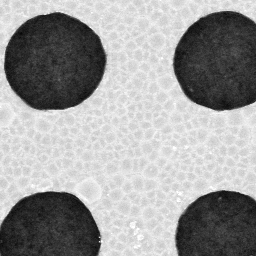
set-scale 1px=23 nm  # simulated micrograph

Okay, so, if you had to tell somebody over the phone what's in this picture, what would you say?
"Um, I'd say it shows holes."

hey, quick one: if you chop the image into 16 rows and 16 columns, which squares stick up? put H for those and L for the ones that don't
HHHHHHHHHHHHHHHH
HLLLLHHHHHHHLLLL
HLLLLLHHHHHLLLLL
LLLLLLLHHHHLLLLL
LLLLLLLHHHHLLLLL
HLLLLLHHHHHLLLLL
HHLLLHHHHHHHLLLL
HHHHHHHHHHHHHHHH
HHHHHHHHHHHHHHHH
HHHHHHHHHHHHHHHH
HHHHHHHHHHHHHHHH
HHHHHHHHHHHHHHHH
HLLLLHHHHHHHLLLL
LLLLLLHHHHHLLLLL
LLLLLLHHHHHLLLLL
LLLLLLHHHHHLLLLL